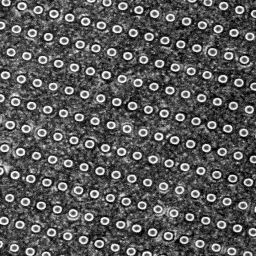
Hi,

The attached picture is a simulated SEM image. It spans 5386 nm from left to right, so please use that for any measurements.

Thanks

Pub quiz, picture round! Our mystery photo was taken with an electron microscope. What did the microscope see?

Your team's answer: a regular array of raised bodies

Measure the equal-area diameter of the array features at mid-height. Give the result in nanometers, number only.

166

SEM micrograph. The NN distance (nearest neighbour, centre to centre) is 342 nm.